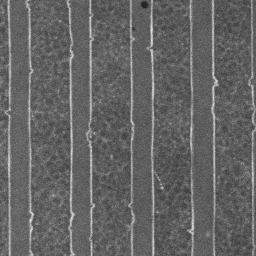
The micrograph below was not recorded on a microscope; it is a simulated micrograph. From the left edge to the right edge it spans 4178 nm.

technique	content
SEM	one or a few lines or trenches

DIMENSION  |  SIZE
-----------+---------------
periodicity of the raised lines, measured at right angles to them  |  0.994 micrometres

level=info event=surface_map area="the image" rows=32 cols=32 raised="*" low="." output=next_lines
*...****...*****...*****...****.
*...*****..*****...*****...****.
*...*****..*****...*****...****.
*...*****..*****...*****...****.
*...*****..*****...*****...****.
*...*****..*****...*****...****.
*...*****..*****...*****...*****
*...*****..*****...*****...*****
*...*****..*****...*****...*****
*...*****..*****...*****...*****
*...*****..*****...*****...****.
*...*****..*****...*****...*****
*...*****..*****...*****...*****
*...*****..*****...*****..******
*...*****..*****...*****...*****
*...*****..******..*****...*****
*...*****..******..*****...*****
*...*****..*****...*****...*****
*...*****..*****...*****...*****
*...*****..*****...*****...*****
*...*****..*****...*****...*****
*...*****..*****...*****...*****
*...*****..*****...*****...*****
*...*****..*****...*****...*****
*...*****..*****...*****...*****
*...*****..*****...*****...*****
*...*****..******..*****...*****
*...*****..******..*****...*****
*...*****..*****...*****...*****
*...*****..*****...*****...*****
*...*****..*****...*****...*****
*...*****..*****...*****...*****